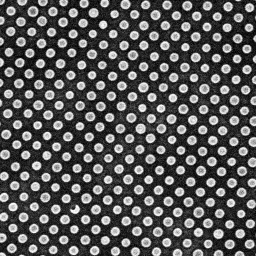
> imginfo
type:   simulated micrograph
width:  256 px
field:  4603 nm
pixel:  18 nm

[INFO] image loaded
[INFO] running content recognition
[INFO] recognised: a regular array of raised bodies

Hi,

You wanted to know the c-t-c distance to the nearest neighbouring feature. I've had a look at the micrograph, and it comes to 252 nm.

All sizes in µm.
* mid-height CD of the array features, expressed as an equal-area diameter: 0.145